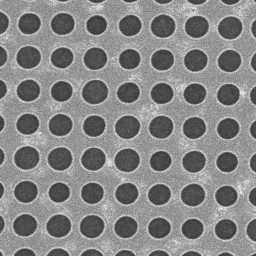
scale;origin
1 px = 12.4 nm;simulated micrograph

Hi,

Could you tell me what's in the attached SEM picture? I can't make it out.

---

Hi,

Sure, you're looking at a regular array of holes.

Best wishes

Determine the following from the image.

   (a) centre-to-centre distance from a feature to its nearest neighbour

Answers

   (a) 410 nanometres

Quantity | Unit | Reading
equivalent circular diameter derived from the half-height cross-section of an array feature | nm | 284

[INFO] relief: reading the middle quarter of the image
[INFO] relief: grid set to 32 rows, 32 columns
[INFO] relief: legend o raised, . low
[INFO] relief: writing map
.oooo.....oooo....oooo.....ooo..
ooooooo.oooooooo.oooooo...ooooo.
oooooooooooooooooooooooooooooooo
oooooooooooooooooooooooooooooooo
.ooooo....oooooo.ooooooooooooooo
..ooo......ooo....ooooo...ooooo.
..ooo......oo......ooo.....ooo..
..oo.......oo......ooo.....ooo..
.oooo......oo......ooo.....ooo..
oooooo....ooooo...ooooo...ooooo.
oooooooooooooooooooooooooooooooo
oooooooooooooooooooooooooooooooo
oooooooooooooooooooooooooooooooo
..oooo....oooo....oooo.....ooooo
..ooo.....ooo......oo......ooo..
..ooo......oo......oo......ooo..
..ooo.....ooo......oo......ooo..
.ooooo...oooo.....oooo.....ooo..
oooooooooooooo...oooooo..oooooo.
oooooooooooooooooooooooooooooooo
oooooooooooooooooooooooooooooooo
.ooooo...ooooo....oooooooooooooo
..ooo.....ooo......ooo....ooooo.
..oo.......oo......oo......ooo..
..oo......ooo......oo......oo...
.oooo.....ooo......ooo....oooo..
.ooooo...ooooo....oooo...ooooo..
oooooooooooooooooooooooooooooooo
oooooooooooooooooooooooooooooooo
ooooooo.oooooooooooooooooooooooo
.oooo....ooooo....oooo....oooo..
.ooo......ooo......oo......oo...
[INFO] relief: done